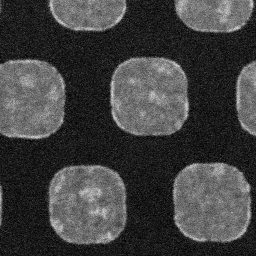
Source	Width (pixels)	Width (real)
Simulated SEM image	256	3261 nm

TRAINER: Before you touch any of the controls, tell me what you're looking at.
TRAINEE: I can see raised bodies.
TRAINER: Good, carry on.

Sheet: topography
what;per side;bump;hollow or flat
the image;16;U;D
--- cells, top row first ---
DDDUUUUUDDDUUUUU
DDDDUUUDDDDDUUUD
DDDDDDDDDDDDDDDD
DDDDDDDDDDDDDDDD
UUUUDDDUUUUDDDDU
UUUUDDDUUUUUDDDU
UUUUDDDUUUUUDDDU
UUUUDDDUUUUUDDDU
DUUDDDDDDDDDDDDD
DDDDDDDDDDDDDDDD
DDDDDDDDDDDDUUUD
DDDDDDDDDDDUUUUD
DDDDDDDDDDDUUUUU
DDDDDDDDDDDUUUUU
DDDDDDDDDDDUUUUD
DDDDDDDDDDDDDDDD